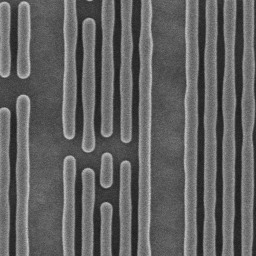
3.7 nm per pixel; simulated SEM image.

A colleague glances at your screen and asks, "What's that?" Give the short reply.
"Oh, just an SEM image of groups of lines, slits or small figures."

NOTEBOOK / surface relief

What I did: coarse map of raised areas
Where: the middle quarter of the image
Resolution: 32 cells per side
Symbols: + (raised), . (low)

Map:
+++..+++..++..+++..+++.........+
+++..+++..++..+++..+++.........+
+++..+++..++..+++..+++.........+
+++..+++..++..+++..+++.........+
+++.++++..++..+++..+++.........+
+++.++++.+++..+++..+++.........+
+++.++++.+++..+++..+++.........+
+++..+++.+++..+++..+++........++
+++..+++.+++..+++..+++........++
+++..+++.+++..+++..+++........++
+++..+++.+++..+++..+++........++
+++..++..+++..+++..+++........++
+++..++..+++..+++..+++........++
+++..++..+++..+++..+++........++
+++..++..+++..+++..+++........++
+++..++..+++..+++..+++........++
+++..++..+++..+++..+++........++
+++..++..+++..+++..+++........++
.+...+++......+++..++.........++
.....+++.......+...++.........++
.....+++...........++.........++
.....++............++.........++
..........+........++.........++
++........++.......++.........++
+++......+++...+...++.........++
+++......+++..++...++.........++
+++..++..+++..++...++.........++
+++.+++..+++..++...++.........++
+++.++++.+++..++...++.........++
+++..+++.+++..++...++.........++
+++..++...++..++...++.........++
+++..+++......++...+++........++